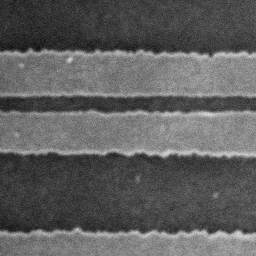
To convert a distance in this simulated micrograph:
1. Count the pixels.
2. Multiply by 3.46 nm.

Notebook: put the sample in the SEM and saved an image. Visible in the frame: lines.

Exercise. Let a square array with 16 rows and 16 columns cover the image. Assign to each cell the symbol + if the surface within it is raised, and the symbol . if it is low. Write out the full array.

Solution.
................
................
................
++++++++++++++++
++++++++++++++++
++++++++++++++++
++++++++++++++++
++++++++++++++++
++++++++++++++++
.++.++++++++++++
................
................
................
................
..+++.......+...
++++++++++++++++